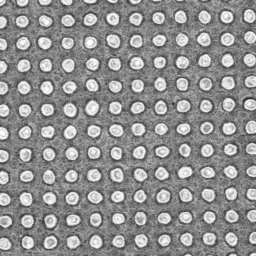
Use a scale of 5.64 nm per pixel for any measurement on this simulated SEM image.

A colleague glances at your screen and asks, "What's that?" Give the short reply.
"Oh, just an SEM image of a regular array of raised bodies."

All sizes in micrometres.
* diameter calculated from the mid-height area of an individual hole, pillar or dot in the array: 0.0643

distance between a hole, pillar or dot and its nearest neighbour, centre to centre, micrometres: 0.123